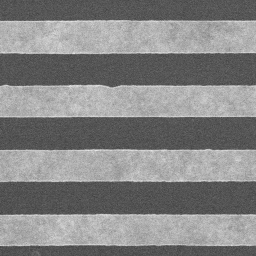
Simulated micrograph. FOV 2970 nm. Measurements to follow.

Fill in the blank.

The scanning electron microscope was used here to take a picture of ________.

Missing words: one or a few lines or trenches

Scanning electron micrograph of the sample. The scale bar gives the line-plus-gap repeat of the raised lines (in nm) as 746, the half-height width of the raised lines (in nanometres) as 362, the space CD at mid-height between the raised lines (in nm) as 384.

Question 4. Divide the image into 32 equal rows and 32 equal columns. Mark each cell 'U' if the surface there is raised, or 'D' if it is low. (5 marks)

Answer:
DDDDDDDDDDDDDDDDDDDDDDDDDDDDDDDD
DDDDDDDDDDDDDDDDDDDDDDDDDDDDDDDD
DDDDDDDDDDDDDDDDDDDDDDDDDDDDDDDD
UUUUUUUUUUUUUUUUUUUUUUUUUUUUUUUU
UUUUUUUUUUUUUUUUUUUUUUUUUUUUUUUU
UUUUUUUUUUUUUUUUUUUUUUUUUUUUUUUU
UUUUUUUUUUUUUUUUUUUUUUUUUUUUUUUU
DDDDDDDDDDDDDDDDDDDDDDDDDDDDDDDD
DDDDDDDDDDDDDDDDDDDDDDDDDDDDDDDD
DDDDDDDDDDDDDDDDDDDDDDDDDDDDDDDD
DDDDDDDDDDDDDDDDDDDDDDDDDDDDDDDD
UUUUUUUUUUUUUUUUUUUUUUUUUUUUUUUU
UUUUUUUUUUUUUUUUUUUUUUUUUUUUUUUU
UUUUUUUUUUUUUUUUUUUUUUUUUUUUUUUU
UUUUUUUUUUUUUUUUUUUUUUUUUUUUUUUU
DDDDDDDDDDDDDDDDDDDDDDDDDDDDDDDD
DDDDDDDDDDDDDDDDDDDDDDDDDDDDDDDD
DDDDDDDDDDDDDDDDDDDDDDDDDDDDDDDD
DDDDDDDDDDDDDDDDDDDDDDDDDDDDDDDD
UUUUUUUUUUUUUUUUUUUUUUUUUUUUUUUU
UUUUUUUUUUUUUUUUUUUUUUUUUUUUUUUU
UUUUUUUUUUUUUUUUUUUUUUUUUUUUUUUU
UUUUUUUUUUUUUUUUUUUUUUUUUUUUUUUU
DDDDDDDDDDDDDDDDDDDDDDDDDDDDDDDD
DDDDDDDDDDDDDDDDDDDDDDDDDDDDDDDD
DDDDDDDDDDDDDDDDDDDDDDDDDDDDDDDD
DDDDDDDDDDDDDDDDDDDDDDDDDDDDDDDD
UUUUUUUUUUUUUUUUUUUUUUUUUUUUUUUU
UUUUUUUUUUUUUUUUUUUUUUUUUUUUUUUU
UUUUUUUUUUUUUUUUUUUUUUUUUUUUUUUU
UUUUUUUUUUUUUUUUUUUUUUUUUUUUUUUU
DDDDDDDDDDDDDDDDDDDDDDDDDDDDDDDD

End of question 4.